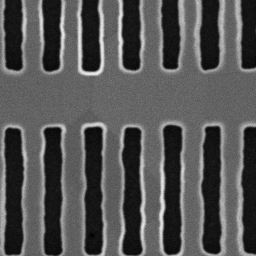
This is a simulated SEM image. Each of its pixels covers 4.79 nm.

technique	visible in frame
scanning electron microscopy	holes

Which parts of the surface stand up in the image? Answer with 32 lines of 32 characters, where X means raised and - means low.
X--XX---XX--XXX---XX--XXX---XX--
---XX---XX--XXX---XX--XXX---XX--
---XX---XX--XXX---XX--XXX--XXX--
---XX---XX--XXX---XX--XXX--XXX--
X--XX---XX--XXX---XX---XX--XXX--
---XX---XX--XXX---XX---XX--XXX--
---XX---XX---XX---XX---XX--XXX--
X--XX---XX---XX---XX--XXX--XXX--
X--XX--XXX--XXXX-XXXX-XXX--XXX--
XXXXXXXXXXXXXXXXXXXXXXXXXXXXXXXX
XXXXXXXXXXXXXXXXXXXXXXXXXXXXXXXX
XXXXXXXXXXXXXXXXXXXXXXXXXXXXXXXX
XXXXXXXXXXXXXXXXXXXXXXXXXXXXXXXX
XXXXXXXXXXXXXXXXXXXXXXXXXXXXXXXX
XXXXXXXXXXXXXXXXXXXXXXXXXXXXXXXX
XXXXXXXXXXXXXXXXXXXXXXXXXXXXXXXX
X--XX---XXX--XXX--XX---XXX--XX--
---XXX--XXX--XX---XX---XX---XX--
X--XXX--XXX--XX---XX---XX---XX--
X--XX---XXX--XX---XX---XX---XX--
X--XX---XXX--XX---XX---XX---XX--
X--XX---XX---XXX--XX---XX---XX--
X--XX---XXX--XX---XX---XX---XX--
X--XXX--XXX--XX---XX---XX---XX--
X--XXX--XX---XX---XX---XX--XXX--
X--XX---XX---XX---XXX--XX--XXX--
X--XXX--XXX--XX---XXX--XX---XX--
X--XX---XXX--XX---XX---XX---XX--
X--XX---XX---XX---XX---XX---XX--
---XX---XXX--XX---XX---XX---XX--
---XX---XXX--XX---XX---XX---XX--
X--XXX--XXX--XX---XXX-XXXX-XXXX-